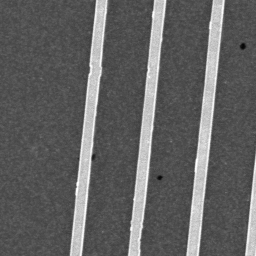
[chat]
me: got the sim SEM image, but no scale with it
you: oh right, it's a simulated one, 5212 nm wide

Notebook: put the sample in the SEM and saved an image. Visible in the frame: parallel lines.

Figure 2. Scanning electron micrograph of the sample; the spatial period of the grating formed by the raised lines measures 1180 nm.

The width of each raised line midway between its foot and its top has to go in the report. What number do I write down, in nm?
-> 213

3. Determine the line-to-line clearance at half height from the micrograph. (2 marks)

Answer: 970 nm